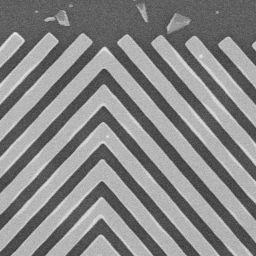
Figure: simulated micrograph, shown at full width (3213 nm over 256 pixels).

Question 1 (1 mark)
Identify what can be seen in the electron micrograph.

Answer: groups of lines, slits or small figures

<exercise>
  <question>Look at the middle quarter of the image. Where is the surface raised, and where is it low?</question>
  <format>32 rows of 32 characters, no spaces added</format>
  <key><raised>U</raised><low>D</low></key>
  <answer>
UUDDDUUUUUUUUUUDDDUUUUUDDDDUUUUD
UDDDDUUUUDDUUUUDDDDUUUUUDDDUUUUU
DDDDUUUUDDDDUUUUDDDDUUUUUDDDUUUU
DDDUUUUDDDDDDUUUUDDDDUUUUDDDDUUU
DDUUUUUDDDDDDUUUUUDDDDUUUUDDDDUU
DUUUUDDDDUDDDDUUUUUDDDDUUUUDDDDU
UUUUUDDDUUUDDDDUUUUUDDDUUUUUDDDD
UUUUDDDDUUUUDDDDUUUUUDDDUUUUUDDD
UUUDDDDUUUUUUDDDDUUUUDDDDUUUUUDD
UUDDDDUUUUUUUUDDDDUUUUDDDDUUUUDD
UDDDDUUUUDUUUUUDDDDUUUUDDDDUUUUD
DDDDUUUUDDDUUUUUDDDUUUUUDDDDUUUU
DDDUUUUDDDDDUUUUDDDDUUUUUDDDDUUU
DDUUUUUDDDDDDUUUUDDDDUUUUUDDDDUU
DUUUUUDDDDDDDDUUUUDDDDUUUUUDDDDU
UUUUUDDDDUUDDDDUUUUDDDDUUUUDDDDU
UUUUDDDDUUUUDDDDUUUUDDDDUUUUDDDD
UUUDDDDUUUUUUDDDDUUUUDDDUUUUUDDD
UUDDDDUUUUUUUDDDDUUUUUDDDUUUUUDD
UDDDDUUUUUUUUUDDDDUUUUUDDDUUUUUD
DDDDUUUUUDDUUUUDDDDUUUUUDDDUUUUU
DDDUUUUUDDDDUUUUDDDDUUUUDDDDUUUU
DDUUUUUDDDDDUUUUUDDDDUUUUDDDDUUU
DUUUUUDDDDDDDUUUUUDDDUUUUUDDDDUU
UUUUUDDDDUDDDDUUUUUDDDUUUUUDDDUU
UUUUDDDDUUUDDDDUUUUUDDDUUUUUDDDU
UUUDDDDUUUUUDDDDUUUUDDDDUUUUUDDD
UUDDDDUUUUUUUDDDDUUUUDDDDUUUUUDD
UDDDDUUUUUUUUUDDDUUUUUDDDDUUUUDD
DDDDUUUUUDUUUUUDDDUUUUUDDDDUUUUD
DDDUUUUUDDDUUUUUDDDUUUUUDDDUUUUU
DDUUUUUDDDDDUUUUDDDDUUUUUDDDUUUU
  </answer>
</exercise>